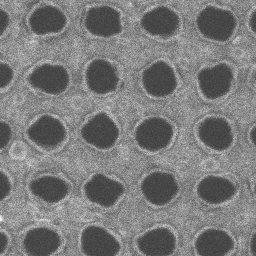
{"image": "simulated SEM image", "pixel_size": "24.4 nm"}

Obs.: a regular array of raised bodies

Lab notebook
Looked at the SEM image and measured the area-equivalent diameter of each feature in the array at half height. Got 966 nanometres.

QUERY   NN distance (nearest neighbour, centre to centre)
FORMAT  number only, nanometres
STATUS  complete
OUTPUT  1320